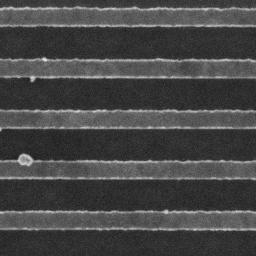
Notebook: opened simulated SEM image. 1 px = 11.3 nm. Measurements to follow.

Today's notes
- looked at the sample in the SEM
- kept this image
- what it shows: lines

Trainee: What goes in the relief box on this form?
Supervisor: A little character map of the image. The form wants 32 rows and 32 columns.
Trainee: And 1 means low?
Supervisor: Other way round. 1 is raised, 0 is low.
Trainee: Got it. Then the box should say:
00000000000000000000000000000000
11111111111111111111111111111111
11111111111111111111111111111111
00000000000000000000000000000000
00000000000000000000000000000000
00000000000000000000000000000000
00000000000000000000000000000000
11111111111111111111111111111111
11111111111111111111111111111111
11111111111111111111111111111111
00000000000000000000000000000000
00000000000000000000000000000000
00000000000000000000000000000000
00000000000000000000000000000000
11111111111111111111111111111111
11111111111111111111111111111111
00000000000000000000000000000000
00000000000000000000000000000000
00000000000000000000000000000000
00010000000000000000000000000000
11111111111111111111111111111111
11111111111111111111111111111111
00000000000000000000000000000000
00000000000000000000000000000000
00000000000000000000000000000000
00000000000000000000000000000000
11011111111010101111111111111111
11111111111111111111111111111111
11111111111111111111111111111111
00000000000000000000000000000000
00000000000000000000000000000000
00000000000000000000000000000000